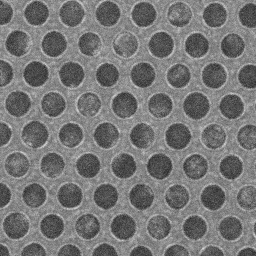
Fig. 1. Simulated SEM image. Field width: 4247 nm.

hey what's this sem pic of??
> a regular array of holes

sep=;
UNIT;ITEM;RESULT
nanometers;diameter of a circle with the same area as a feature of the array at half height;435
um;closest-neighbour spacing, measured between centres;0.581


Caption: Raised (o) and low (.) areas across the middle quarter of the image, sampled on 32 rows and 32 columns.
....ooooo....oooo.....ooooo....o
.....ooo......ooo......ooo......
.....ooo......oo.......ooo......
.....ooo......ooo......oo.......
.....ooo......ooo......ooo.....o
....ooooo...oooooo....ooooo....o
oooooooooooooooooooooooooooooooo
ooooo...ooooo....oooooo...ooooo.
oooo.....ooo......ooo......ooo..
.oo......ooo......ooo......ooo..
.oo......ooo.......oo......oo...
ooo......ooo......ooo......ooo..
oooo....ooooo.....oooo.....ooo..
oooooooooooooo..ooooooo..oooooo.
oooooooooo.ooooooooooooooooooooo
....oooo.....ooooo....oooo.....o
.....ooo......ooo.....ooo.......
.....oo.......oo.......oo.......
.....oo.......oo.......oo.......
.....ooo......ooo......oo.......
...ooooo.....ooooo....oooo.....o
oooooooooooooooooooooooooooo.ooo
ooooo...oooooo...ooooo...ooooooo
ooo......ooo.....oooo......ooo..
ooo......ooo......ooo......ooo..
ooo......ooo......oo.......oo...
ooo......ooo......ooo......ooo..
oooo.....ooo......ooo......ooo..
ooooo..oooooo....ooooo....ooooo.
o.oooooooooooooooooooooooooooooo
....ooooo....oooo....oooooo...oo
....oooo.....ooo......oooo.....o